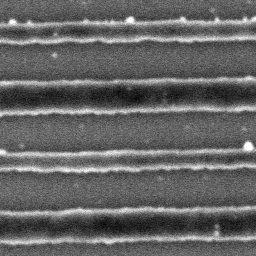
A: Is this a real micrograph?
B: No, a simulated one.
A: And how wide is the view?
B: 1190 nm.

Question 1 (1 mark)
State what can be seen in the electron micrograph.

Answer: lines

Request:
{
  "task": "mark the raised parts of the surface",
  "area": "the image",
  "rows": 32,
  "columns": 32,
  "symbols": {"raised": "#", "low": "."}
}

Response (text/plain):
................................
................................
................#.....#........#
################################
################################
..#.............................
................................
................................
................................
................................
################################
################################
################################
################################
................................
................................
................................
................................
..............................##
################################
################################
................................
................................
................................
................................
................................
##.#############################
################################
################################
################################
................................
................................